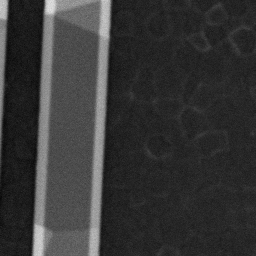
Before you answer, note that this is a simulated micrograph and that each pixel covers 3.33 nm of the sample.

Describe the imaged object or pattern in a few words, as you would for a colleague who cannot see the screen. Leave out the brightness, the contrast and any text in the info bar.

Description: one or a few lines or trenches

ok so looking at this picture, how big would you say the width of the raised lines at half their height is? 186 nanometres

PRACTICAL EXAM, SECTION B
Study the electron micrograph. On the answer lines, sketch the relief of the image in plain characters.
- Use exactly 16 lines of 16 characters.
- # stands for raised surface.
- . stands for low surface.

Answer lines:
...####.........
...####.........
...###..........
...###..........
...###..........
...###..........
...###..........
...###..........
...###..........
...###..........
...###..........
...###..........
...###..........
..####..........
..####..........
..####..........